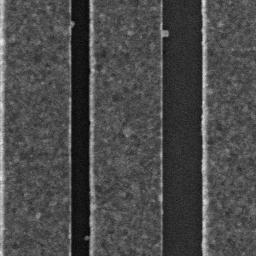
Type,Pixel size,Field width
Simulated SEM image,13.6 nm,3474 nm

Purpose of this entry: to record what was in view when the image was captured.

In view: lines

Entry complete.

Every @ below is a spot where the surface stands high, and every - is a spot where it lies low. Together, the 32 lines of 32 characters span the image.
@@@@@@@@@--@@@@@@@@@-----@@@@@@@
@@@@@@@@@--@@@@@@@@@-----@@@@@@@
@@@@@@@@@--@@@@@@@@@-----@@@@@@@
@@@@@@@@@--@@@@@@@@@-----@@@@@@@
@@@@@@@@@--@@@@@@@@@-----@@@@@@@
@@@@@@@@@--@@@@@@@@@-----@@@@@@@
@@@@@@@@@--@@@@@@@@@-----@@@@@@@
@@@@@@@@@--@@@@@@@@@-----@@@@@@@
@@@@@@@@@--@@@@@@@@@-----@@@@@@@
@@@@@@@@@--@@@@@@@@@-----@@@@@@@
@@@@@@@@@--@@@@@@@@@-----@@@@@@@
@@@@@@@@@--@@@@@@@@@-----@@@@@@@
@@@@@@@@@--@@@@@@@@@-----@@@@@@@
@@@@@@@@@--@@@@@@@@@-----@@@@@@@
@@@@@@@@@--@@@@@@@@@-----@@@@@@@
@@@@@@@@@--@@@@@@@@@-----@@@@@@@
@@@@@@@@@--@@@@@@@@@-----@@@@@@@
@@@@@@@@@--@@@@@@@@@-----@@@@@@@
@@@@@@@@@--@@@@@@@@@-----@@@@@@@
@@@@@@@@@--@@@@@@@@@-----@@@@@@@
@@@@@@@@@--@@@@@@@@@-----@@@@@@@
@@@@@@@@@--@@@@@@@@@-----@@@@@@@
@@@@@@@@@--@@@@@@@@@-----@@@@@@@
@@@@@@@@@--@@@@@@@@@-----@@@@@@@
@@@@@@@@@--@@@@@@@@@-----@@@@@@@
@@@@@@@@@--@@@@@@@@@-----@@@@@@@
@@@@@@@@@--@@@@@@@@@-----@@@@@@@
@@@@@@@@@--@@@@@@@@@-----@@@@@@@
@@@@@@@@@--@@@@@@@@@-----@@@@@@@
@@@@@@@@@--@@@@@@@@@-----@@@@@@@
@@@@@@@@@--@@@@@@@@@-----@@@@@@@
@@@@@@@@@--@@@@@@@@@-----@@@@@@@